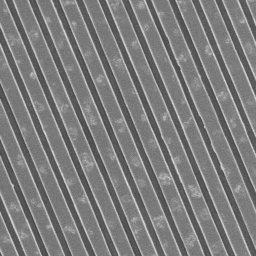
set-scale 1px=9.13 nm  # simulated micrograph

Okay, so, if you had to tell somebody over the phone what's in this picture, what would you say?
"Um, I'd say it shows parallel lines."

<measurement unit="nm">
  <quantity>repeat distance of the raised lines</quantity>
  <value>196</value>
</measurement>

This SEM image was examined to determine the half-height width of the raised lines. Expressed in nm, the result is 135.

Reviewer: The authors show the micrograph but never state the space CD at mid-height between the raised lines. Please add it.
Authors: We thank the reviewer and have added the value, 63.2 nanometers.